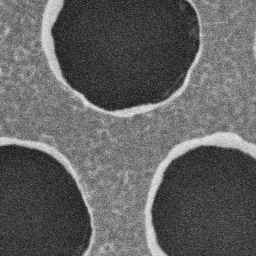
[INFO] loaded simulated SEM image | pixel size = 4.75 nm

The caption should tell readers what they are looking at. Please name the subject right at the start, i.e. holes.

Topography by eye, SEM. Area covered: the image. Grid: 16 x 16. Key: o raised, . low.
ooo.........oooo
ooo.........oooo
ooo..........ooo
ooo.........oooo
oooo........oooo
ooooo......ooooo
oooooo....oooooo
oooooooooooooooo
oooooooooooooooo
...oooooooo.....
....oooooo......
.....ooooo......
.....ooooo......
......ooo.......
......oooo......
......oooo......